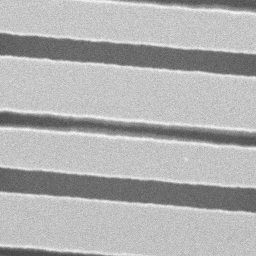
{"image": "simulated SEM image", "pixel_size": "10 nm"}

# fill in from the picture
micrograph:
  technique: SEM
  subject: lines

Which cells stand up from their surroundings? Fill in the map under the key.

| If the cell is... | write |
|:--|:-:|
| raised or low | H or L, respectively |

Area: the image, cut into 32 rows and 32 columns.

HHHHHHHHHHHHHHHHHHHLLLLLLLLLLLLL
HHHHHHHHHHHHHHHHHHHHHHHHHHHHHHHL
HHHHHHHHHHHHHHHHHHHHHHHHHHHHHHHH
HHHHHHHHHHHHHHHHHHHHHHHHHHHHHHHH
LLLLLHHHHHHHHHHHHHHHHHHHHHHHHHHH
LLLLLLLLLLLLLLLLLLHHHHHHHHHHHHHH
LLLLLLLLLLLLLLLLLLLLLLLLLLLLLLHH
HHHHHHLLLLLLLLLLLLLLLLLLLLLLLLLL
HHHHHHHHHHHHHHHHHHLLLLLLLLLLLLLL
HHHHHHHHHHHHHHHHHHHHHHHHHHHHHLLL
HHHHHHHHHHHHHHHHHHHHHHHHHHHHHHHH
HHHHHHHHHHHHHHHHHHHHHHHHHHHHHHHH
HHHHHHHHHHHHHHHHHHHHHHHHHHHHHHHH
HHHHHHHHHHHHHHHHHHHHHHHHHHHHHHHH
LLLLLLLLLHHHHHHHHHHHHHHHHHHHHHHH
LLLLLLLLLLLLLLLLLLLLHHHHHHHHHHHH
HHHHHHHHHHLLLLLLLLLLLLLLLLLLLLLL
HHHHHHHHHHHHHHHHHHHHHLLLLLLLLLLL
HHHHHHHHHHHHHHHHHHHHHHHHHHHHHHHH
HHHHHHHHHHHHHHHHHHHHHHHHHHHHHHHH
HHHHHHHHHHHHHHHHHHHHHHHHHHHHHHHH
LLLLLLLHHHHHHHHHHHHHHHHHHHHHHHHH
LLLLLLLLLLLLLLLLLLLLHHHHHHHHHHHH
LLLLLLLLLLLLLLLLLLLLLLLLLLLLLLLL
HHHHHHLLLLLLLLLLLLLLLLLLLLLLLLLL
HHHHHHHHHHHHHHHHHHLLLLLLLLLLLLLL
HHHHHHHHHHHHHHHHHHHHHHHHHHHHHLLL
HHHHHHHHHHHHHHHHHHHHHHHHHHHHHHHH
HHHHHHHHHHHHHHHHHHHHHHHHHHHHHHHH
HHHHHHHHHHHHHHHHHHHHHHHHHHHHHHHH
HHHHHHHHHHHHHHHHHHHHHHHHHHHHHHHH
LLLLLLLLLLHHHHHHHHHHHHHHHHHHHHHH